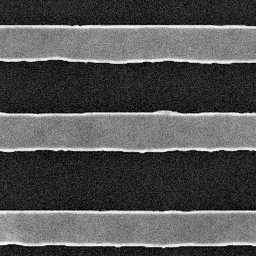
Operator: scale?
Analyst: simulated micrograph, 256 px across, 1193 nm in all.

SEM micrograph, lines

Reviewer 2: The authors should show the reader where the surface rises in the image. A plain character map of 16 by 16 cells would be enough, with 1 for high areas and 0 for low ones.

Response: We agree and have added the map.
0000000000000000
0000000000000000
1111111111111111
1111111111111111
0000000000000000
0000000000000000
0000000000000000
1111111111111111
1111111111111111
0000000010000000
0000000000000000
0000000000000000
0000000000000000
1111111111111111
1111111111111111
0000000000000000